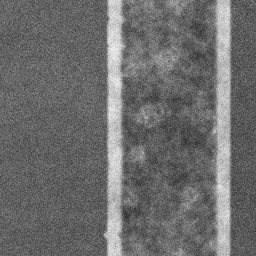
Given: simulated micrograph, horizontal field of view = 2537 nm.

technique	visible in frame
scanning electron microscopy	one or a few lines or trenches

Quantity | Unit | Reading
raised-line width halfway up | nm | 1070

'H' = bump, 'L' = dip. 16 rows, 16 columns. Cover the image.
LLLLLLLHHHHHHHLL
LLLLLLLHHHHHHHLL
LLLLLLLHHHHHHHLL
LLLLLLLHHHHHHHLL
LLLLLLLHHHHHHHLL
LLLLLLLHHHHHHHLL
LLLLLLLHHHHHHHLL
LLLLLLLHHHHHHHLL
LLLLLLLHHHHHHHLL
LLLLLLLHHHHHHHLL
LLLLLLLHHHHHHHLL
LLLLLLLHHHHHHHLL
LLLLLLLHHHHHHHLL
LLLLLLLHHHHHHHLL
LLLLLLLHHHHHHHLL
LLLLLLLHHHHHHHLL